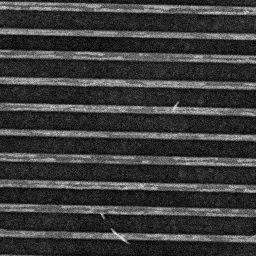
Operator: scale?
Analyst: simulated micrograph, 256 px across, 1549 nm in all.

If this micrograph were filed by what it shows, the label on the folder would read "parallel lines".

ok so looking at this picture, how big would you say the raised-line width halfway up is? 43.1 nanometres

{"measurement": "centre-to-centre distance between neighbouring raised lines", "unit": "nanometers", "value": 153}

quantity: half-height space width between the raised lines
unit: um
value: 0.112